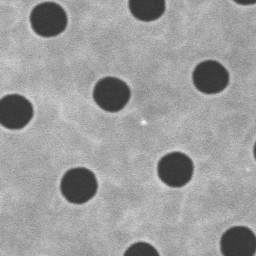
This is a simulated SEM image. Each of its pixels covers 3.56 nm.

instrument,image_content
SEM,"holes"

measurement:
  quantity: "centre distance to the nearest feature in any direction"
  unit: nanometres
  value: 349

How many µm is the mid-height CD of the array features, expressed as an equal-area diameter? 0.131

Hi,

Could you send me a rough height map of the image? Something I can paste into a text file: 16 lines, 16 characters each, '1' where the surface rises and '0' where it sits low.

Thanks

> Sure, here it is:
1100111100111111
1100111111111111
1111111111111111
1111111111111111
1111111111110011
1111110011110011
0011110011111111
0011111111111111
1111111111111111
1111111111111111
1111111111001111
1111001111001111
1111001111111111
1111111111111111
1111111111111100
1111111100111100